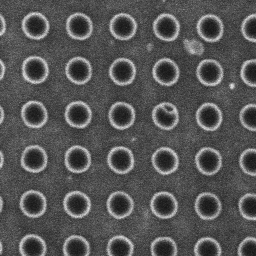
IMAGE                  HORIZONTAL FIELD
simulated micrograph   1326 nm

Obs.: a regular array of raised bodies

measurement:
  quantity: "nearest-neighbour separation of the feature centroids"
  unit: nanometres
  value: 226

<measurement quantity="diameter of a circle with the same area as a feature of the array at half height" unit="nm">133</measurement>